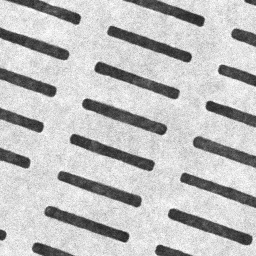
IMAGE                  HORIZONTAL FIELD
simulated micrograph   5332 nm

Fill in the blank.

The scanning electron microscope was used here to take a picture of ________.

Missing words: holes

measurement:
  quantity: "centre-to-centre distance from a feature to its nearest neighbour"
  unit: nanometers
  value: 794